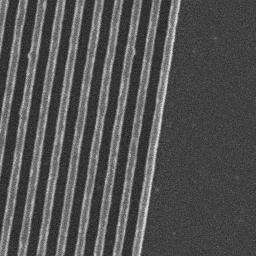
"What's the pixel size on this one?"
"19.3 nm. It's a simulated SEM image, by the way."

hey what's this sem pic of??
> parallel lines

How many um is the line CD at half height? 0.133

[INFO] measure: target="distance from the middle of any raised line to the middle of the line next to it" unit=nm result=363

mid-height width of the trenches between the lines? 229 nm